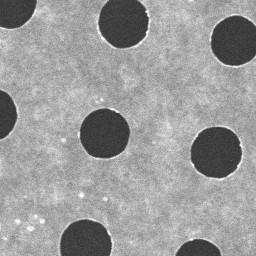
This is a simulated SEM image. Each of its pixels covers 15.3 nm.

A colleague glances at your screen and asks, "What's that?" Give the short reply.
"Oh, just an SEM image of holes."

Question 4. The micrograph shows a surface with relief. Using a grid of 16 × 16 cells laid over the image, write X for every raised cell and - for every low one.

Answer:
--XXXX---XXXXXXX
-XXXXX---XXXXX--
XXXXXXX--XXXX---
XXXXXXXXXXXXX---
XXXXXXXXXXXXXXXX
XXXXXXXXXXXXXXXX
-XXXXXXXXXXXXXXX
-XXXX---XXXXXXXX
XXXXX---XXXX---X
XXXXX---XXXX---X
XXXXXXXXXXXX---X
XXXXXXXXXXXXXXXX
XXXXXXXXXXXXXXXX
XXXXXXXXXXXXXXXX
XXXX---XXXXXXXXX
XXXX---XXXX---XX